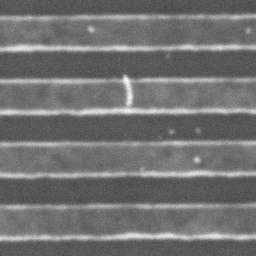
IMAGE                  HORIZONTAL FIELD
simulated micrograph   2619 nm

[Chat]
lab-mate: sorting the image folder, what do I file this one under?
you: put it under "lines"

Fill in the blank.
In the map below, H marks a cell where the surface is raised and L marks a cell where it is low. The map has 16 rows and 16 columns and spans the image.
LLLLLLLLLLLLLLLL
HHHHHHHHHHHHHHHH
HHHHHHHHHHHHHHHH
LLLLLLLLLLLLLLLL
LLLLLLLLLLLLLLLL
HHHHHHHHHHHHHHHH
HHHHHHHHHHHHHHHH
LLLLLLLLLLLLLLLL
LLLLLLLLLLLLLLLL
HHHHHHHHHHHHHHHH
HHHHHHHHHHHHHHHH
LLLLLLLLLLLLLLLL
LLLLLLLLLLLLLLLL
HHHHHHHHHHHHHHHH
HHHHHHHHHHHHHHHH
LLLLLLLLLLLLLLLL